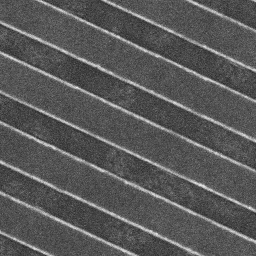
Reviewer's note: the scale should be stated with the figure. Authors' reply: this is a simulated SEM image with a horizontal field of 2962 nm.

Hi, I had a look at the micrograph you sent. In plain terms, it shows parallel lines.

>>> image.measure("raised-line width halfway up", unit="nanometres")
438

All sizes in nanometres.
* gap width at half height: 302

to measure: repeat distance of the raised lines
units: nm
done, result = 736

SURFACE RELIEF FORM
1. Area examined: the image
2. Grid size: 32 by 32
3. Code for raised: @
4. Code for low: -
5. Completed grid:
@@@@@@--------@@@@@@@@@@@-------
@@@@@@@@--------@@@@@@@@@@@-----
@@@@@@@@@@--------@@@@@@@@@@@---
-@@@@@@@@@@@@-------@@@@@@@@@@@-
----@@@@@@@@@@@-------@@@@@@@@@@
------@@@@@@@@@@@--------@@@@@@@
--------@@@@@@@@@@@--------@@@@@
@@--------@@@@@@@@@@@--------@@@
@@@@@-------@@@@@@@@@@@--------@
@@@@@@@-------@@@@@@@@@@@-------
@@@@@@@@@-------@@@@@@@@@@@@----
@@@@@@@@@@@--------@@@@@@@@@@@--
--@@@@@@@@@@@--------@@@@@@@@@@@
----@@@@@@@@@@@--------@@@@@@@@@
------@@@@@@@@@@@--------@@@@@@@
@-------@@@@@@@@@@@--------@@@@@
@@@--------@@@@@@@@@@@-------@@@
@@@@@--------@@@@@@@@@@@-------@
@@@@@@@--------@@@@@@@@@@@------
@@@@@@@@@--------@@@@@@@@@@@----
@@@@@@@@@@@--------@@@@@@@@@@@--
---@@@@@@@@@@--------@@@@@@@@@@@
-----@@@@@@@@@@@-------@@@@@@@@@
-------@@@@@@@@@@@--------@@@@@@
@--------@@@@@@@@@@@--------@@@@
@@@--------@@@@@@@@@@@--------@@
@@@@@--------@@@@@@@@@@@--------
@@@@@@@--------@@@@@@@@@@@------
@@@@@@@@@@-------@@@@@@@@@@@----
-@@@@@@@@@@@--------@@@@@@@@@@@-
---@@@@@@@@@@@--------@@@@@@@@@@
-----@@@@@@@@@@@--------@@@@@@@@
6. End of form